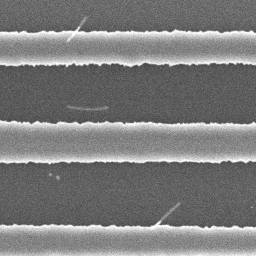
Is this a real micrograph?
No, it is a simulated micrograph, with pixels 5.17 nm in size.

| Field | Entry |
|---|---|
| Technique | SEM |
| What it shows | lines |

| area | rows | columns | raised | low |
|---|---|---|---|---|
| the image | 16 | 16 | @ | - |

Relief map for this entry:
----------------
----------------
@@@@@@@@@@@@@@@@
@@@@@@@@@@@@@@@@
----------------
----------------
----------------
----------------
@@@@@@@@@@@@@@@@
@@@@@@@@@@@@@@@@
----------------
----------------
----------------
----------------
@@@@@@@@@@@@@@@@
@@@@@@@@@@@@@@@@